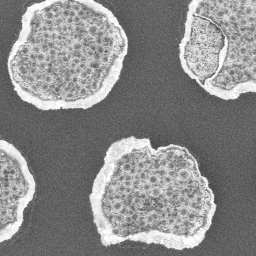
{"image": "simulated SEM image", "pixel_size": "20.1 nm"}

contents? raised bodies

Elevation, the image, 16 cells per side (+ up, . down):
..++++......++++
..+++++......+++
.+++++++......++
.+++++++.....+++
.++++++.....++++
.++++++......++.
................
................
................
+......+++++....
++.....+++++....
++....+++++++...
++....+++++++...
+.....+++++++...
+......++++++...
................